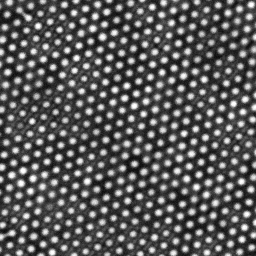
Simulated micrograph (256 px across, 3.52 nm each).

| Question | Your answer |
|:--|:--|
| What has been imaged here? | a regular array of raised bodies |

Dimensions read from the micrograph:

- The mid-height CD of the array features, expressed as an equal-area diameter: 21.7 nm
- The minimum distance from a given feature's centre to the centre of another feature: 0.043 um